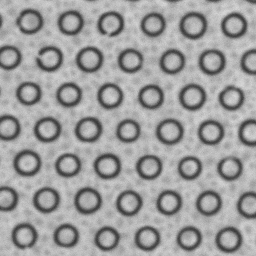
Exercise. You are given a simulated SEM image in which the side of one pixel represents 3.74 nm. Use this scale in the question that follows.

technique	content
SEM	a regular array of ring-shaped grooves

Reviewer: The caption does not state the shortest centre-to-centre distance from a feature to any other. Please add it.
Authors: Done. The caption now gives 148 nm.